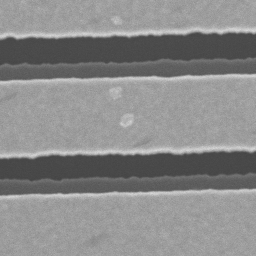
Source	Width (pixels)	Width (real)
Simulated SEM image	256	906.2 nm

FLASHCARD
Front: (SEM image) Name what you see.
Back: lines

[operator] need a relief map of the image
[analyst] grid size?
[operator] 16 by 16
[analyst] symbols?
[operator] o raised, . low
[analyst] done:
oooooooooooooooo
oooooooooooooooo
................
................
................
oooooooooooooooo
oooooooooooooooo
oooooooooooooooo
oooooooooooooooo
ooooooooooooo...
................
................
oooooooooooooooo
oooooooooooooooo
oooooooooooooooo
oooooooooooooooo